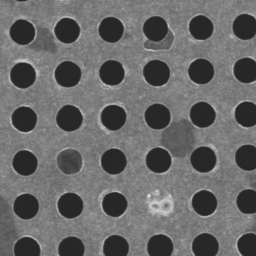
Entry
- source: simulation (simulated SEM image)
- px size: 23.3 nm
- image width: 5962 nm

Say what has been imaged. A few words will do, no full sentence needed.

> a regular array of holes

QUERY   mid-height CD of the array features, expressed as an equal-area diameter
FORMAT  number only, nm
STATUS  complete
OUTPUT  599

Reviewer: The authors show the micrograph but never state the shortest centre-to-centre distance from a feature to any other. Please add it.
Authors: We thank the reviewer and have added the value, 43.6 px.